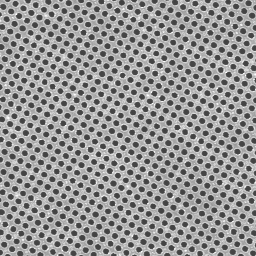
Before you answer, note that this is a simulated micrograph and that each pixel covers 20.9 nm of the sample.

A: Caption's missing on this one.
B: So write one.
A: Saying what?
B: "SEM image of a regular array of holes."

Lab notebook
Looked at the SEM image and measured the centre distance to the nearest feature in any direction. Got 185 nanometres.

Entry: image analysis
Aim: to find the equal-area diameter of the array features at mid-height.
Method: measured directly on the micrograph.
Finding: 120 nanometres